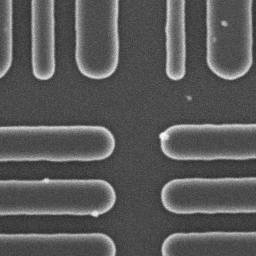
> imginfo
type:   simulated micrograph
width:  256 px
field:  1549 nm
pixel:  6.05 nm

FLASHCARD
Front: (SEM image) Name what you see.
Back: groups of lines, slits or small figures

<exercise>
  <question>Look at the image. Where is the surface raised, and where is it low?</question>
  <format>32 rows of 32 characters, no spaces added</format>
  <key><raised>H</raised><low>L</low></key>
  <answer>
HLLLHHHLLLHHHHHLLLLLLHHLLLHHHHHL
HLLLHHHLLLHHHHHLLLLLLHHLLLHHHHHL
HLLLHHHLLLHHHHHLLLLLLHHLLLHHHHHL
HLLLHHHLLLHHHHHLLLLLLHHLLLHHHHHL
HLLLHHHLLLHHHHHLLLLLLHHLLLHHHHHL
HLLLHHHLLLHHHHHLLLLLLHHLLLHHHHHL
HLLLHHHLLLHHHHHLLLLLLHHLLLHHHHHL
HLLLHHHLLLHHHHHLLLLLLHHLLLHHHHHL
HLLLHHHLLLHHHHLLLLLLLHHLLLHHHHHL
LLLLLHLLLLLHHLLLLLLLLHHLLLLHHHLL
LLLLLLLLLLLLLLLLLLLLLLLLLLLLLLLL
LLLLLLLLLLLLLLLLLLLLLLLLLLLLLLLL
LLLLLLLLLLLLLLLLLLLLLLLLLLLLLLLL
LLLLLLLLLLLLLLLLLLLLLLLLLLLLLLLL
LLLLLLLLLLLLLLLLLLLLLLLLLLLLLLLL
LLLLLLLLLLLLLLLLLLLLLLLLLLLLLLLL
HHHHHHHHHHHHHHLLLLLLLHHHHHHHHHHH
HHHHHHHHHHHHHHLLLLLLHHHHHHHHHHHH
HHHHHHHHHHHHHHLLLLLLHHHHHHHHHHHH
HHHHHHHHHHHHHLLLLLLLLHHHHHHHHHHH
LLLLLLLLLLLLLLLLLLLLLLLLLLLLLLLL
LLLLLLLLLLLLLLLLLLLLLLLLLLLLLLLL
LLLLLLLLLLLLLLLLLLLLLLLHHHHHHHHH
HHHHHHHHHHHHHHLLLLLLLHHHHHHHHHHH
HHHHHHHHHHHHHHLLLLLLHHHHHHHHHHHH
HHHHHHHHHHHHHHLLLLLLHHHHHHHHHHHH
HHHHHHHHHHHHHLLLLLLLLLHHHHHLLLLL
LLLLLLLLLLLLLLLLLLLLLLLLLLLLLLLL
LLLLLLLLLLLLLLLLLLLLLLLLLLLLLLLL
HHHHHHHHHHHHHLLLLLLLLHHHHHHHHHHH
HHHHHHHHHHHHHHLLLLLLHHHHHHHHHHHH
HHHHHHHHHHHHHHLLLLLLHHHHHHHHHHHH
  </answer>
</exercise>